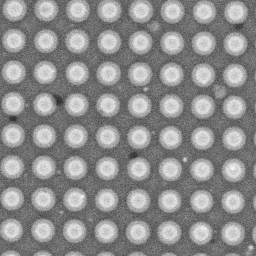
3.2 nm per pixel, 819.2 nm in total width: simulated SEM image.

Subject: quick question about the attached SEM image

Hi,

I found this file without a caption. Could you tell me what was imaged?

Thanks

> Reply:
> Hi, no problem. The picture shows an array of small figures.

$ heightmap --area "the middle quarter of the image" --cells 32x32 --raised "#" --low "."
.####....####....####....####...
.#####..######..######..######..
.#####..######..######..######..
.#####..######..######..######..
..###....####....####....####...
................................
................................
..##......##....................
.####....####....####....####...
######..######..######..######..
######..######..######..######..
.#####..######..######..######..
.####....####....####....####...
................................
................................
..##......##....................
.####....####...#####....####...
######..######..######..#####...
######..######..######..#####...
######..######..#####...#####...
.####....####....####....####...
................................
................................
.###......##......##............
#####...#####...#####...#####...
######..######..#####...#####...
######..######..#####...#####...
#####...#####...#####...#####...
.####....###.....###.....####...
................................
................................
.###.....###.....###............